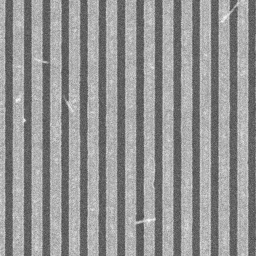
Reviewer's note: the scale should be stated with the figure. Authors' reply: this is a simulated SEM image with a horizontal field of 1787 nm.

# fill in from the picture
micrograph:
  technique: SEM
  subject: parallel lines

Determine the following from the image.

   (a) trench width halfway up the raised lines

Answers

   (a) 60.2 nm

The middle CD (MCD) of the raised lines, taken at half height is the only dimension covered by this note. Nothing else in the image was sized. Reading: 73.3 nm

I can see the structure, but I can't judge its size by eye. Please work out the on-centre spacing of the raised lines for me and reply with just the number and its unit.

130 nm